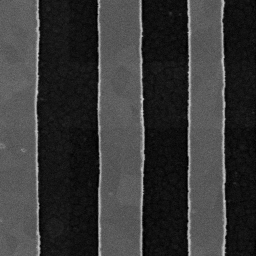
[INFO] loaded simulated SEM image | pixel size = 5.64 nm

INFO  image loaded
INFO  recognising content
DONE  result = one or a few lines or trenches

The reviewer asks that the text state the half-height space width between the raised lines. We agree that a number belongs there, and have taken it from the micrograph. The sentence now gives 306 nanometers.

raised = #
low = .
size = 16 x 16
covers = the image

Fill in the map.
##....###...##..
##....###...##..
##....###...##..
##....###...##..
##....###...##..
##....###...##..
##....###...##..
##....###...##..
##....###...##..
##....###...##..
##....###...##..
##....###...##..
##....###...##..
##....###...##..
##....###...##..
##....###...##..